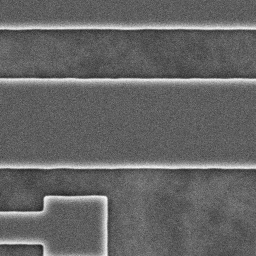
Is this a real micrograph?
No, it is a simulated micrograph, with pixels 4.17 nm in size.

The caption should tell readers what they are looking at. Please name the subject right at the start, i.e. groups of lines, slits or small figures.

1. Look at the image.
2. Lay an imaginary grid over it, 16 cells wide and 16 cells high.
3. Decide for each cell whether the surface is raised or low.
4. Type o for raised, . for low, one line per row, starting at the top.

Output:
oooooooooooooooo
oooooooooooooooo
................
................
................
oooooooooooooooo
oooooooooooooooo
oooooooooooooooo
oooooooooooooooo
oooooooooooooooo
..oo............
................
...ooo..........
ooooooo.........
ooooooo.........
...oooo.........